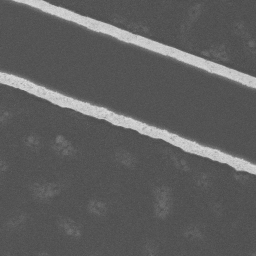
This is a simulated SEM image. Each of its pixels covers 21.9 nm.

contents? one or a few lines or trenches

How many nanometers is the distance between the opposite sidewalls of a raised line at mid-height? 1790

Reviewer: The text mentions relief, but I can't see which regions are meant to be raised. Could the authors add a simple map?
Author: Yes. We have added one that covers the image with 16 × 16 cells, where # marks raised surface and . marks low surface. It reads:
###.............
######..........
#########.......
###########.....
##############..
..##############
.....###########
.......#########
..........######
.............###
................
................
................
................
................
................